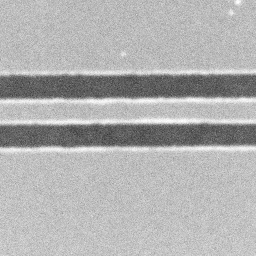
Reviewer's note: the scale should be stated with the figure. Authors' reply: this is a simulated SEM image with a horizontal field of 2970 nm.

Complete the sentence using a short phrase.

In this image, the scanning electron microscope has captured lines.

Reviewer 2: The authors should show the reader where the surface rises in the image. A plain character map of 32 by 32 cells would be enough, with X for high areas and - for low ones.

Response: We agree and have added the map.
XXXXXXXXXXXXXXXXXXXXXXXXXXXXXXXX
XXXXXXXXXXXXXXXXXXXXXXXXXXXXXXXX
XXXXXXXXXXXXXXXXXXXXXXXXXXXXXXXX
XXXXXXXXXXXXXXXXXXXXXXXXXXXXXXXX
XXXXXXXXXXXXXXXXXXXXXXXXXXXXXXXX
XXXXXXXXXXXXXXXXXXXXXXXXXXXXXXXX
XXXXXXXXXXXXXXXXXXXXXXXXXXXXXXXX
XXXXXXXXXXXXXXXXXXXXXXXXXXXXXXXX
XXXXXXXXXXXXXXXXXXXXXXXXXXXXXXXX
--------------------------------
--------------------------------
--------------------------------
------XX-----XXX-XXXXXXXXXXXXXXX
XXXXXXXXXXXXXXXXXXXXXXXXXXXXXXXX
XXXXXXXXXXXXXXXXXXXXXXXXXXXXXXXX
--------------------------------
--------------------------------
--------------------------------
------------------------X------X
XXXXXXXXXXXXXXXXXXXXXXXXXXXXXXXX
XXXXXXXXXXXXXXXXXXXXXXXXXXXXXXXX
XXXXXXXXXXXXXXXXXXXXXXXXXXXXXXXX
XXXXXXXXXXXXXXXXXXXXXXXXXXXXXXXX
XXXXXXXXXXXXXXXXXXXXXXXXXXXXXXXX
XXXXXXXXXXXXXXXXXXXXXXXXXXXXXXXX
XXXXXXXXXXXXXXXXXXXXXXXXXXXXXXXX
XXXXXXXXXXXXXXXXXXXXXXXXXXXXXXXX
XXXXXXXXXXXXXXXXXXXXXXXXXXXXXXXX
XXXXXXXXXXXXXXXXXXXXXXXXXXXXXXXX
XXXXXXXXXXXXXXXXXXXXXXXXXXXXXXXX
XXXXXXXXXXXXXXXXXXXXXXXXXXXXXXXX
XXXXXXXXXXXXXXXXXXXXXXXXXXXXXXXX